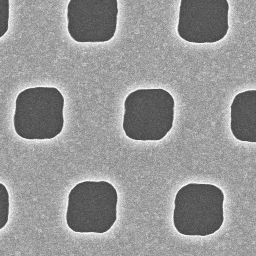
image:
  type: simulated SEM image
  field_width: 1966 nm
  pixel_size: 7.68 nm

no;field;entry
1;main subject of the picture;holes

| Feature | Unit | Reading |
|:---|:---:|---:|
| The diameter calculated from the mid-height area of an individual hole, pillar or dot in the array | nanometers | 417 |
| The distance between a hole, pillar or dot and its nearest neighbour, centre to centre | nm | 821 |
